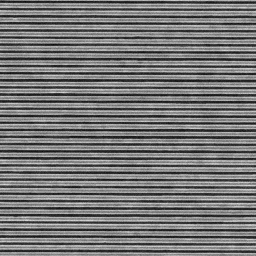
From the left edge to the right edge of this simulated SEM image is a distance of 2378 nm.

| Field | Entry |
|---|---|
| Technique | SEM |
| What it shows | parallel lines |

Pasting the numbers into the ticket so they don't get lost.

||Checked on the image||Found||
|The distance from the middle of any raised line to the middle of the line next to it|66.1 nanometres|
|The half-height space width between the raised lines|34.8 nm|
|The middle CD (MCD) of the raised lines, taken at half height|34.8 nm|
